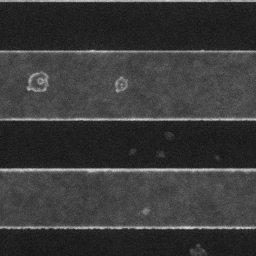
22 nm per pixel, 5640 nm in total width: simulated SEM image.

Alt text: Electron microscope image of lines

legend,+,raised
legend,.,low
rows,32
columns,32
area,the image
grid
................................
................................
................................
................................
................................
................................
++++++++++++++++++++++++++++++++
++++++++++++++++++++++++++++++++
++++++++++++++++++++++++++++++++
++++++++++++++++++++++++++++++++
++++++++++++++++++++++++++++++++
++++++++++++++++++++++++++++++++
++++++++++++++++++++++++++++++++
++++++++++++++++++++++++++++++++
++++++++++++++++++++++++++++++++
................................
................................
................................
................................
................................
................................
++++++++++++++++++++++++++++++++
++++++++++++++++++++++++++++++++
++++++++++++++++++++++++++++++++
++++++++++++++++++++++++++++++++
++++++++++++++++++++++++++++++++
++++++++++++++++++++++++++++++++
++++++++++++++++++++++++++++++++
..+.++..++++++++.+++++++++++.+++
................................
................................
................................